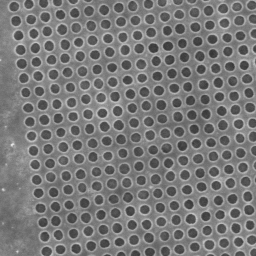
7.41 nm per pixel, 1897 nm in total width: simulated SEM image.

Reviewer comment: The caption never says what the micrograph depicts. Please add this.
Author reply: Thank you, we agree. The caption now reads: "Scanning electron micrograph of a regular array of holes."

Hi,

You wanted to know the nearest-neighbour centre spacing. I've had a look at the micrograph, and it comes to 104 nanometers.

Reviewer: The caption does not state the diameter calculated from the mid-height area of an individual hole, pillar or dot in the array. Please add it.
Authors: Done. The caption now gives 74.4 nanometres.